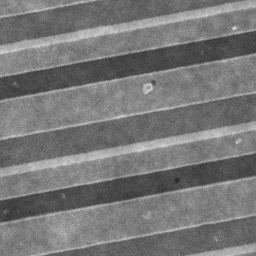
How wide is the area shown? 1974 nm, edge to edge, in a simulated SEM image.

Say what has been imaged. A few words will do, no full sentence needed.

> lines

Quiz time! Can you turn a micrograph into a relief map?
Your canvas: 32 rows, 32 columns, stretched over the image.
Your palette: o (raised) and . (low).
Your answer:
ooooooooo......................o
oooo.....................ooooooo
....................oooooooooooo
...............ooooooooooooooooo
.........ooooooooooooooooooo....
...ooooooooooooooooooo..........
ooooooooooooooooo...............
oooooooooooo................oooo
oooooo................oooooooooo
o................ooooooooooooooo
...........ooooooooooooooooooooo
......oooooooooooooooooooooooooo
ooooooooooooooooooooooooooo.....
oooooooooooooooooooooo..........
oooooooooooooooo................
ooooooooooo.....................
ooooo......................ooooo
......................oooooooooo
................oooooooooooooooo
...........ooooooooooooooooooo..
.....ooooooooooooooooooo........
ooooooooooooooooooo.............
oooooooooooooo...............ooo
oooooooo................oooooooo
ooo................ooooooooooooo
.............ooooooooooooooooooo
........oooooooooooooooooooooooo
..ooooooooooooooooooooooooooo...
ooooooooooooooooooooooo.........
oooooooooooooooooo..............
ooooooooooooo...................
ooooooo.....................oooo